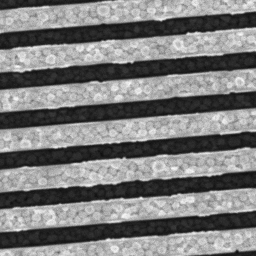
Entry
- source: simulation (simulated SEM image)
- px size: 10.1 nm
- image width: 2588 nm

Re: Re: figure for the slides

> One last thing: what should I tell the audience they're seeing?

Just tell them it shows parallel lines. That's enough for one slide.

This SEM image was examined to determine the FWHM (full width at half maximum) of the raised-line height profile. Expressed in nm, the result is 233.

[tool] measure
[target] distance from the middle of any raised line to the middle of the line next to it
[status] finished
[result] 0.401 microns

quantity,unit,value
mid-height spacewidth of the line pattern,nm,171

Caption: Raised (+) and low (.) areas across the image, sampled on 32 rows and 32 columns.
.........+++++++++++++++++++++++
+++++++++++++++++++++++++++++++.
++++++++++++++++++++............
+++++++........................+
.....................+++++++++++
........++++++++++++++++++++++++
+++++++++++++++++++++++++++++++.
+++++++++++++++++++.............
+++++++.........................
.....................+++++++++++
.........+++++++++++++++++++++++
+++++++++++++++++++++++++++++++.
+++++++++++++++++++.............
++++++++........................
....................++++++++++++
........++++++++++++++++++++++++
++++++++++++++++++++++++++++++..
+++++++++++++++++++.............
+++++++.......................++
...................+++++++++++++
........++++++++++++++++++++++++
++++++++++++++++++++++++++++++..
+++++++++++++++++++.............
++++++..........................
....................++++++++++++
........++++++++++++++++++++++++
++++++++++++++++++++++++++++++..
++++++++++++++++++..............
+++++++........................+
...................+.+++++++++++
.........+++++++++++++++++++++++
+++++++++++++++++++++++++++++...